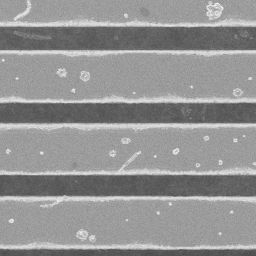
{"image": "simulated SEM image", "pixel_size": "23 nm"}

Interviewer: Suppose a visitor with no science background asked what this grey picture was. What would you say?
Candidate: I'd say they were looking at lines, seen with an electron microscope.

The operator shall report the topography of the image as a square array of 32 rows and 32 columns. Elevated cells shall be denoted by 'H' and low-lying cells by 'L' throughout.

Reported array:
HHHHHHHHHHHHHHHHHHHHHHHHHHHHHHHH
HHHHHHHHHHHHHHHHHHHHHHHHHHHHHHHH
HHHHHHHHHHHHHHHHHHHHHHHHHHHHHHHH
LLLLLLLLLLLLLLLLLLLLLLLLLLLLLLLL
LLLLLLLLLLLLLLLLLLLLLLLLLLLLLLLL
LLLLLLLLLLLLLLLLLLLLLLLLLLLLLLLL
HHHHHHHHHHHHHHHHHHHHHHHHHHHHHHHH
HHHHHHHHHHHHHHHHHHHHHHHHHHHHHHHH
HHHHHHHHHHHHHHHHHHHHHHHHHHHHHHHH
HHHHHHHHHHHHHHHHHHHHHHHHHHHHHHHH
HHHHHHHHHHHHHHHHHHHHHHHHHHHHHHHH
HHHHHHHHHHHHHHHHHHHHHHHHHHHHHHHH
HHHHHHHHHHHHHHHHHHHHHHHHHHHHHHHH
LLLLLLLLLLLLLLLLLLLLLLLLLLLLLLLL
LLLLLLLLLLLLLLLLLLLLLLLLLLLLLLLL
HHHHHHHHHHHHHHHHHHHHHHHHHHHHHHHH
HHHHHHHHHHHHHHHHHHHHHHHHHHHHHHHH
HHHHHHHHHHHHHHHHHHHHHHHHHHHHHHHH
HHHHHHHHHHHHHHHHHHHHHHHHHHHHHHHH
HHHHHHHHHHHHHHHHHHHHHHHHHHHHHHHH
HHHHHHHHHHHHHHHHHHHHHHHHHHHHHHHH
HHHHHHHHHHHHHHHHHHHHHHHHHHHHHHHH
LLLLLLLLLLLLLLLLLLLLLLLLLLLLLLLL
LLLLLLLLLLLLLLLLLLLLLLLLLLLLLLLL
LLLLLLLLHLLLLLLLLLLLLLLLLLLLLLLL
HHHHHHHHHHHHHHHHHHHHHHHHHHHHHHHH
HHHHHHHHHHHHHHHHHHHHHHHHHHHHHHHH
HHHHHHHHHHHHHHHHHHHHHHHHHHHHHHHH
HHHHHHHHHHHHHHHHHHHHHHHHHHHHHHHH
HHHHHHHHHHHHHHHHHHHHHHHHHHHHHHHH
HHHHHHHHHHHHHHHHHHHHHHHHHHHHHHHH
LLLLLLLLLLLLLLLLLLLLLLLLLLLLLLLL